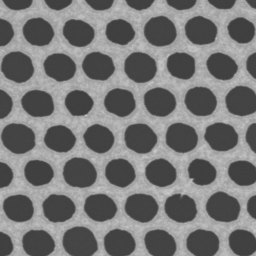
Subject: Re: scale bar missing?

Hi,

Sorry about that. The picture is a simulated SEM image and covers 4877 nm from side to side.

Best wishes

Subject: a regular array of holes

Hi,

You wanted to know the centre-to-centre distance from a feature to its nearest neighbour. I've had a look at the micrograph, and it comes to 758 nanometers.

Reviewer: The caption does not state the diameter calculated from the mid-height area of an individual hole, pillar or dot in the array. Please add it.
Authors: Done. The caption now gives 577 nm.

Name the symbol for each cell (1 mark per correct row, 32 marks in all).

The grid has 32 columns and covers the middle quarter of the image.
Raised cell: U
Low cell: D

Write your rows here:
DDDUDDDDDDDDDUUDDDDDDDDUUUDDDDDD
DDDUUDDDDDDDDUUDDDDDDDDUUUDDDDDD
DDDUUDDDDDDDUUUDDDDDDDDUUUUDDDDD
DDUUUUDDDDDUUUUUDDDDDDUUUUUUDDDD
UUUUUUUUUUUUUUUUUUDDDUUUUUUUUUUU
UUUUUUUUUUUUUUUUUUUUUUUUUUUUUUUU
UUUUUUUUUUUUDDDDUUUUUDDDDDUUUUUD
UDDDDDUUUUUDDDDDDUUUDDDDDDDUUUUD
DDDDDDDUUUDDDDDDDDUUDDDDDDDDUUDD
DDDDDDDUUUDDDDDDDDUUDDDDDDDDUUDD
DDDDDDDUUUDDDDDDDDUUDDDDDDDDUUDD
UDDDDDDUUUUDDDDDDDUUUDDDDDDDUUUD
UUDDDDUUUUUUDDDDDUUUUUDDDDUUUUUU
UUUUUUUUUUUUUUUUUUUUUUUUUUUUUUUU
UUUUUUUUUUUUUUUUUUUUUUUUUUUUUUUU
UUUUUUUDDDUUUUUUDDDDDUUUUUDDDDDD
DDUUUUDDDDDDUUUDDDDDDDUUUUDDDDDD
DDUUUDDDDDDDUUUDDDDDDDDUUDDDDDDD
DDDUUDDDDDDDDUUDDDDDDDDUUDDDDDDD
DDDUUDDDDDDDUUUDDDDDDDDUUUDDDDDD
DDUUUUDDDDDDUUUUDDDDDDDUUUDDDDDD
DDUUUUUDDDDUUUUUUDDDDDUUUUUDDDDD
UUUUUUUUUUUUUUUUUUUDUUUUUUUUUUUU
UUDDUUUUUUUUUUUUUUUUUUUUUUUUUUUU
UDDDDDDUUUUDDDDDUUUUUUDDDDUUUUUU
DDDDDDDUUUDDDDDDDUUUUDDDDDDUUUUD
DDDDDDDDUUDDDDDDDDUUDDDDDDDDUUUD
DDDDDDDDUUDDDDDDDDUUDDDDDDDDUUUD
DDDDDDDDUUDDDDDDDDUUUDDDDDDDUUUD
DDDDDDDDUUUDDDDDDUUUUDDDDDDUUUUU
UDDDDDUUUUUUUDDDUUUUUUUDDDUUUUUU
UUUUUUUUUUUUUUUUUUUUUUUUUUUUUUUU